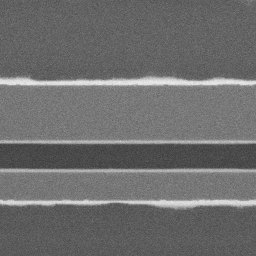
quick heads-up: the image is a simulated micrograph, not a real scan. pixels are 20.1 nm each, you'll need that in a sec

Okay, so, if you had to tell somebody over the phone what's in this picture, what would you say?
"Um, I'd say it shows lines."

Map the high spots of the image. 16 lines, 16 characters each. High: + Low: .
................
................
................
................
................
++++++++++++++++
++++++++++++++++
++++++++++++++++
++++++++++++++++
................
................
++++++++++++++++
++++++++++++++++
................
................
................